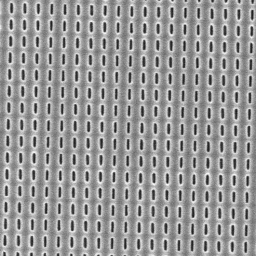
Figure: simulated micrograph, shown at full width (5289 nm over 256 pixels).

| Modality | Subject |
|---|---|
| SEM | a regular array of holes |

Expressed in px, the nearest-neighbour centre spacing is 13.3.